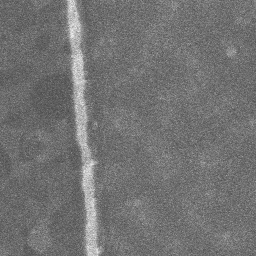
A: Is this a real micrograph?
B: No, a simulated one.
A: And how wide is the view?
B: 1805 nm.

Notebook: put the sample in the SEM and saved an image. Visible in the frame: one or a few lines or trenches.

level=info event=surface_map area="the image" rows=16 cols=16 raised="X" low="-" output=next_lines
XXXXX-----------
XXXXX-----------
XXXXX-----------
XXXXX-----------
XXXXX-----------
XXXXX-----------
XXXXX-----------
XXXXX-----------
XXXXX-----------
XXXXX-----------
XXXXXX----------
XXXXXX----------
XXXXXX----------
XXXXXX----------
XXXXXX----------
XXXXXX----------